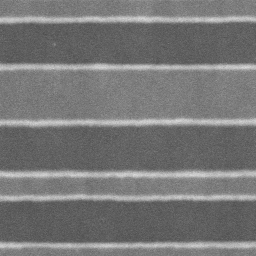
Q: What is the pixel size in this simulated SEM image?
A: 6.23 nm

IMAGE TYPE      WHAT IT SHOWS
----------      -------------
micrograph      lines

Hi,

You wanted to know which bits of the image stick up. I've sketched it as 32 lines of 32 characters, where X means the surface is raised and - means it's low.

XXXXXXXXXXXXXXXXXXXXXXXXXXXXXXXX
XXXXXXXXXXXXXXXXXXXXXXXXXXXXXXXX
--------------------------------
--------------------------------
--------------------------------
--------------------------------
--------------------------------
--------------------------------
-XXXXXXX--XXXXXXXXXXXXX-XXXXXXXX
XXXXXXXXXXXXXXXXXXXXXXXXXXXXXXXX
XXXXXXXXXXXXXXXXXXXXXXXXXXXXXXXX
XXXXXXXXXXXXXXXXXXXXXXXXXXXXXXXX
XXXXXXXXXXXXXXXXXXXXXXXXXXXXXXXX
XXXXXXXXXXXXXXXXXXXXXXXXXXXXXXXX
XXXXXXXXXXXXXXXXXXXXXXXXXXXXXXXX
--------------------------------
--------------------------------
--------------------------------
--------------------------------
--------------------------------
--------------------------------
--------------------------------
XXXXXXXXXXXXXXXXXXXXXXXXXXXXXXXX
XXXXXXXXXXXXXXXXXXXXXXXXXXXXXXXX
XXXXXXXXXXXXXXXXXXXXXXXXXXXXXXXX
--------------------------------
--------------------------------
--------------------------------
--------------------------------
--------------------------------
--------------------------------
XXXXXXXXXXXXXXXXXXXXXXXXXXXXXXXX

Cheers